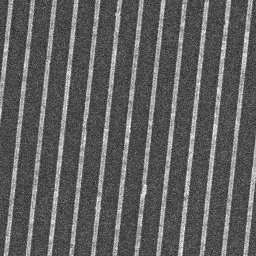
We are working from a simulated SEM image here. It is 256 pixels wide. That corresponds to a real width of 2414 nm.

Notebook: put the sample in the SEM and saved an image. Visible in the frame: parallel lines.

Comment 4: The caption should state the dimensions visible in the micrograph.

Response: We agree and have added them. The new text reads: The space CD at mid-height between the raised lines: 172 nm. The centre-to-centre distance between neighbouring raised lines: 204 nm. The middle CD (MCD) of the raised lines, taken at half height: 32.8 nanometres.